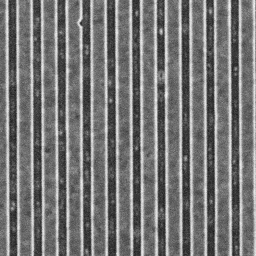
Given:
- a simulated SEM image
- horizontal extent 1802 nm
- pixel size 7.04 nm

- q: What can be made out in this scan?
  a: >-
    parallel lines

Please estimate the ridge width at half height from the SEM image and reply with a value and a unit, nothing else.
105 nanometres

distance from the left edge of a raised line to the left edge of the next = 174 nm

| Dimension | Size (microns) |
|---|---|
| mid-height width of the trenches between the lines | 0.0695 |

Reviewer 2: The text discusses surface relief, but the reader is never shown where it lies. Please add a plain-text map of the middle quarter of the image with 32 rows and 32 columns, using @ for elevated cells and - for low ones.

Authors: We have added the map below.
-@@@---@@@@--@@@@--@@@@---@@@---
-@@@---@@@@--@@@@--@@@@---@@@---
-@@@---@@@@--@@@@--@@@@---@@@---
-@@@---@@@@--@@@@--@@@@---@@@---
-@@@---@@@@--@@@@--@@@@---@@@---
-@@@---@@@@--@@@@--@@@@---@@@---
-@@@---@@@@--@@@@--@@@@---@@@---
-@@@---@@@@--@@@@--@@@@---@@@---
-@@@---@@@@--@@@@--@@@@---@@@---
-@@@---@@@@--@@@@--@@@@---@@@---
-@@@---@@@@--@@@@--@@@@---@@@---
-@@@---@@@@--@@@@--@@@@---@@@---
-@@@---@@@@--@@@@--@@@@---@@@---
-@@@---@@@@--@@@@--@@@@---@@@---
-@@@---@@@@--@@@@--@@@@---@@@---
-@@@---@@@@--@@@@--@@@@---@@@---
-@@@---@@@@--@@@@--@@@@---@@@---
-@@@---@@@@--@@@@---@@@---@@@---
-@@@---@@@@--@@@@---@@@---@@@---
-@@@---@@@@--@@@@---@@@---@@@---
-@@@---@@@@--@@@@---@@@---@@@---
-@@@---@@@@--@@@@---@@@---@@@---
-@@@---@@@@--@@@@---@@@---@@@---
-@@@---@@@@--@@@@---@@@---@@@---
-@@@---@@@@--@@@@---@@@---@@@---
-@@@---@@@@--@@@@---@@@---@@@---
-@@@---@@@@--@@@@---@@@---@@@---
-@@@---@@@@--@@@@---@@@---@@@---
-@@@---@@@@--@@@@---@@@---@@@---
-@@@---@@@@--@@@@---@@@---@@@---
-@@@---@@@@--@@@@---@@@---@@@---
-@@@---@@@@--@@@@---@@@---@@@---